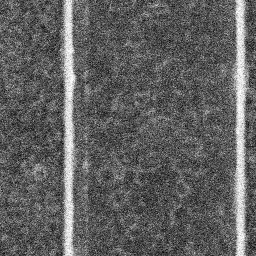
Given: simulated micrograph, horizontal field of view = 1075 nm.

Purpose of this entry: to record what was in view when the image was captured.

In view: one or a few lines or trenches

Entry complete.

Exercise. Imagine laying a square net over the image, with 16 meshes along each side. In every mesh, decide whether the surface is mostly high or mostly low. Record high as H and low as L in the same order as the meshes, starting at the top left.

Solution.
LLLLHHHHHHHHHHHL
LLLLHHHHHHHHHHHL
LLLLHHHHHHHHHHHL
LLLLHHHHHHHHHHHL
LLLLHHHHHHHHHHHL
LLLLHHHHHHHHHHHL
LLLLHHHHHHHHHHHL
LLLLHHHHHHHHHHHL
LLLLHHHHHHHHHHHL
LLLLHHHHHHHHHHHL
LLLLHHHHHHHHHHHL
LLLLHHHHHHHHHHHL
LLLLHHHHHHHHHHHL
LLLLHHHHHHHHHHHL
LLLLHHHHHHHHHHHL
LLLLHHHHHHHHHHHL